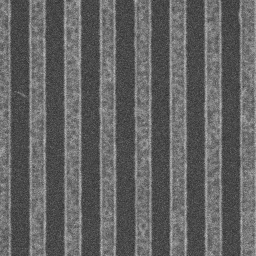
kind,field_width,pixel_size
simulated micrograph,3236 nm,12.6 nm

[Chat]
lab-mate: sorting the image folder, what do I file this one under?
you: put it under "parallel lines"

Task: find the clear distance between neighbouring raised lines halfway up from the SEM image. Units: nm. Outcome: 259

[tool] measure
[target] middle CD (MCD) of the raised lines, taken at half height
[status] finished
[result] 188 nm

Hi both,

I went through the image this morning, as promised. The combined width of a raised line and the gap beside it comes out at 35.1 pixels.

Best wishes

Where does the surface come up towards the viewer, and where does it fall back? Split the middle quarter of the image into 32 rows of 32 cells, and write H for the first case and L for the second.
LHHHLLLLLHHHHLLLLLHHHLLLLLLHHHLL
LHHHLLLLLHHHHLLLLLHHHLLLLLLHHHLL
HHHHLLLLLHHHLLLLLLHHHLLLLLLHHHLL
HHHHLLLLLHHHHLLLLLHHHLLLLLLHHHLL
HHHHLLLLLHHHLLLLLLHHHLLLLLLHHHLL
HHHHLLLLLHHHHLLLLLHHHLLLLLLHHHLL
HHHHLLLLLHHHHLLLLLHHHLLLLLLHHHLL
HHHHLLLLLHHHHLLLLLHHHLLLLLLHHHLL
HHHHLLLLLHHHHLLLLLHHHLLLLLLHHHLL
HHHHLLLLLHHHHLLLLLHHHLLLLLLHHHLL
LHHHLLLLLHHHHLLLLLHHHHLLLLLHHHLL
LHHHLLLLLHHHHLLLLLHHHHLLLLLHHHLL
HHHHLLLLLHHHHLLLLLHHHHLLLLLHHHLL
HHHHLLLLLHHHHLLLLLHHHHLLLLLHHHLL
HHHHLLLLLHHHLLLLLLHHHHLLLLLHHHLL
HHHHLLLLLHHHLLLLLLHHHHLLLLLHHHLL
HHHHLLLLLHHHLLLLLLHHHHLLLLLHHHLL
LHHHLLLLLHHHHLLLLLHHHLLLLLLHHHLL
HHHHLLLLLHHHHLLLLLHHHLLLLLLHHHLL
HHHHLLLLLHHHHLLLLLHHHHLLLLLHHHLL
HHHHLLLLLHHHHLLLLLHHHHLLLLLHHHLL
LHHHLLLLLHHHHLLLLLHHHHLLLLLHHHLL
LHHHLLLLLHHHHLLLLLHHHHLLLLLHHHLL
HHHHLLLLLHHHHLLLLLHHHHLLLLLHHHLL
HHHHLLLLLHHHHLLLLLHHHHLLLLLHHHLL
HHHHLLLLLHHHHLLLLLHHHHLLLLLHHHLL
HHHHLLLLLHHHHLLLLLHHHHLLLLLHHHLL
HHHHLLLLLHHHHLLLLLHHHHLLLLLHHHLL
HHHHLLLLLHHHHLLLLLHHHHLLLLLHHHLL
HHHHLLLLLHHHHLLLLLHHHHLLLLLHHHLL
HHHHLLLLLHHHHLLLLLHHHHLLLLLHHHLL
HHHHLLLLLHHHHLLLLLHHHHLLLLLHHHLL